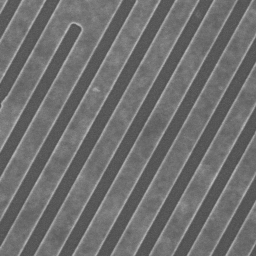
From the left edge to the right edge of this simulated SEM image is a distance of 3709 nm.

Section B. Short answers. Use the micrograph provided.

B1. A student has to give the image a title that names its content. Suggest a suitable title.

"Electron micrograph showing parallel lines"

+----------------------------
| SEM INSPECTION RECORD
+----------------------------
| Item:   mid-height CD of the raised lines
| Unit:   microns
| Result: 0.29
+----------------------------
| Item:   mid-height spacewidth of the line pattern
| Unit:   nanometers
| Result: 193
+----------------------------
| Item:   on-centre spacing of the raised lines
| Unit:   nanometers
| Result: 486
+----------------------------